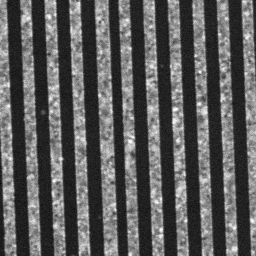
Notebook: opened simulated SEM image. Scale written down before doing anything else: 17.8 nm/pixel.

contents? parallel lines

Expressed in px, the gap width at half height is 14.5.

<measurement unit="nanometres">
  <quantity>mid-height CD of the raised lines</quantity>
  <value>177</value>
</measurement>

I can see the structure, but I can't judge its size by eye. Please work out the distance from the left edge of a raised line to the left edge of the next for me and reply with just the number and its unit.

436 nanometers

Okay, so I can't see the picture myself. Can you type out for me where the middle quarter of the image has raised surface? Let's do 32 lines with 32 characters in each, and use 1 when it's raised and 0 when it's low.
00110000011000111000011000011000
00110000011000111000011000011000
00111000011000011000011000011000
00111000011100011000011000011000
00111000011100011000011000011000
00111000011100011000011000011000
00111000011100011000011000011000
00111000011100011000011000011000
00111000011100011000011000011000
00011000010100011000011000011000
00011000010000011000011000011000
00011000011100011000011000011100
00011000011100011000011000011100
00011000011100011000011000011100
00011000011100011000011100011100
00011000011100011000011100011100
00011000011100011000011100011100
00011000011100011100011100011100
00011000011100011100011100001100
00011000011100011100011100001100
00011000011100001100011100001100
00011000011100011100011100001100
00011000011100011100001100001100
00011000011100011100001100001100
00011000001100001100001100001100
00011000001100001100001100001100
00011000011100001100001100001100
00011000011100001100001100001100
00011100001100011100001100001100
00011100001100001100001100001100
00011100001110001100001100001100
00011100001110001100001100001100